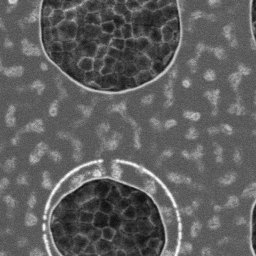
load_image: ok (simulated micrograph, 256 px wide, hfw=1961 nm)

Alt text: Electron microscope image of holes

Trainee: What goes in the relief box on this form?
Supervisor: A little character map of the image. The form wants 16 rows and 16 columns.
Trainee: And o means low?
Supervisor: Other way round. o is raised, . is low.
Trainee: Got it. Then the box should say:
ooo........ooooo
ooo........ooooo
ooo........ooooo
ooo........ooooo
oooo......oooooo
oooooo..oooooooo
oooooooooooooooo
oooooooooooooooo
oooooooooooooooo
oooooooooooooooo
oooooooooooooooo
ooooo...oooooooo
oooo......oooooo
ooo.......oooooo
ooo.......oooooo
oooo......oooooo